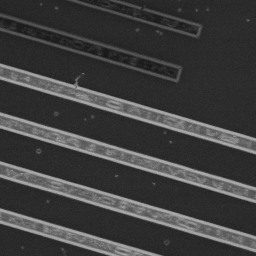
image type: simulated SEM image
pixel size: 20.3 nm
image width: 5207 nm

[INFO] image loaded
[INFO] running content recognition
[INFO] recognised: parallel lines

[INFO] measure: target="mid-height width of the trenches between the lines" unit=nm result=710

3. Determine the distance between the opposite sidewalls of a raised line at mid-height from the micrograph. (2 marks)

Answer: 256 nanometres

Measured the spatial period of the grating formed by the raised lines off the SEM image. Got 952 nanometres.